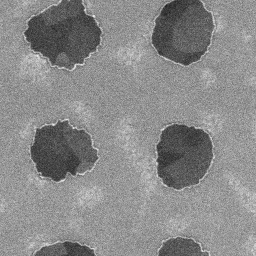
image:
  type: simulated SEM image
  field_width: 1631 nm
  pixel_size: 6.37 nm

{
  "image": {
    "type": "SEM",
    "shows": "raised bodies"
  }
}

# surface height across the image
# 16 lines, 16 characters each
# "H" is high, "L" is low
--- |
LLLHHLLLLLHHHLLL
LLHHHHLLLLHHHLLL
LLHHHHLLLHHHHLLL
LLHHHHLLLLHHHLLL
LLLLLLLLLLLLLLLL
LLLLLLLLLLLLLLLL
LLLLLLLLLLLLLLLL
LLLLLLLLLLLLLLLL
LLHHHHLLLLHHHLLL
LLHHHHLLLLHHHLLL
LLHHHHLLLLHHHLLL
LLLLLLLLLLHHLLLL
LLLLLLLLLLLLLLLL
LLLLLLLLLLLLLLLL
LLLLLLLLLLLLLLLL
LLLHHHLLLLHHHLLL